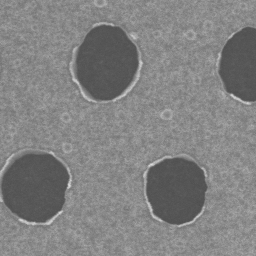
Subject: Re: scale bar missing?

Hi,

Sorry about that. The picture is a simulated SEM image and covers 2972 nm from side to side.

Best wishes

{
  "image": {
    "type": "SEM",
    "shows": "holes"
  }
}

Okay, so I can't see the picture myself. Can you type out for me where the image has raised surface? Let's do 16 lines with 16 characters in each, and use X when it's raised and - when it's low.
XXXXXXXXXXXXXXXX
XXXXXXXXXXXXXXXX
XXXXX---XXXXXX--
XXXXX----XXXXX--
XXXXX----XXXXX--
XXXXX---XXXXXX--
XXXXXXXXXXXXXXXX
XXXXXXXXXXXXXXXX
XXXXXXXXXXXXXXXX
XX-XXXXXXXXXXXXX
----XXXXX----XXX
----XXXXX----XXX
----XXXXX----XXX
X--XXXXXXX--XXXX
XXXXXXXXXXXXXXXX
XXXXXXXXXXXXXXXX